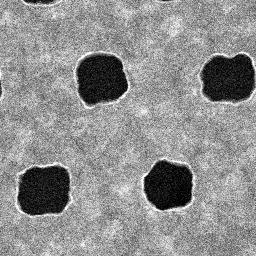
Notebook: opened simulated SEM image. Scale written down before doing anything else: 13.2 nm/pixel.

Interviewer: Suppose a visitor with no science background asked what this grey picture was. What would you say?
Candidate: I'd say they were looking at holes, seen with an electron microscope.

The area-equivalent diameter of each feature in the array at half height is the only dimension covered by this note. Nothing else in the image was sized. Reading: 692 nm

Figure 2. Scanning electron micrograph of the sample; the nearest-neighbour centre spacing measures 1.63 µm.